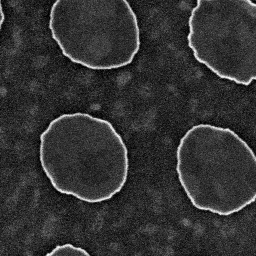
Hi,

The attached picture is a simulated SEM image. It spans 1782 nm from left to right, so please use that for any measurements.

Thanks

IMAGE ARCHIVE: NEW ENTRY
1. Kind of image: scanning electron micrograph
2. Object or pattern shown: raised bodies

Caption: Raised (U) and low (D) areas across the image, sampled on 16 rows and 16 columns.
DDDUUUUUDDDDUUUU
DDDUUUUUUDDDUUUU
DDDDUUUUUDDDUUUU
DDDDUUUUDDDDUUUU
DDDDDDDDDDDDDUUU
DDDDDDDDDDDDDDDD
DDDDDDDDDDDDDDDD
DDDDUUDDDDDDDDDD
DDDUUUUDDDDDUUUD
DDDUUUUUDDDUUUUU
DDDUUUUUDDDUUUUU
DDDUUUUUDDDUUUUU
DDDDDUDDDDDDUUUU
DDDDDDDDDDDDDDDD
DDDDDDDDDDDDDDDD
DDDDUDDDDDDDDDDD